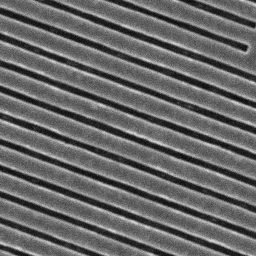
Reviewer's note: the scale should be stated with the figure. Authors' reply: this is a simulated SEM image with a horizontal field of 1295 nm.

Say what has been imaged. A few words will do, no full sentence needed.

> parallel lines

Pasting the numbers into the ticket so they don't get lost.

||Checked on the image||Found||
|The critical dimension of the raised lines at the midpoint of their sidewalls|0.0908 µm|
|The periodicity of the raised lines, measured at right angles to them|0.124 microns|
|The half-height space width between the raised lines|0.0339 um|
